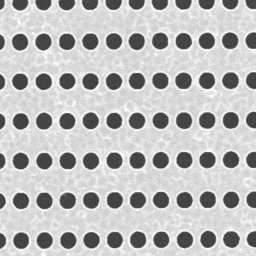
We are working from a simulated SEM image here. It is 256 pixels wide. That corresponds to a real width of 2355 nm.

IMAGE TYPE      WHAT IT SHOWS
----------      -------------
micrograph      a regular array of holes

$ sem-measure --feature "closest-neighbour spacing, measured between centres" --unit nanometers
214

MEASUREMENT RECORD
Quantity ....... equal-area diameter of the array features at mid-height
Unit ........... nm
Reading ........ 157